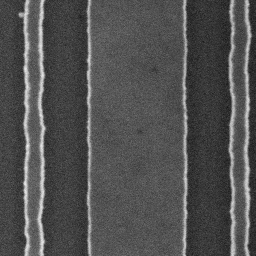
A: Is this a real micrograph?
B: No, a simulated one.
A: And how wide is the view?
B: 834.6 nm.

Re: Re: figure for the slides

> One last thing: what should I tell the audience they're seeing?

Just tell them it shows lines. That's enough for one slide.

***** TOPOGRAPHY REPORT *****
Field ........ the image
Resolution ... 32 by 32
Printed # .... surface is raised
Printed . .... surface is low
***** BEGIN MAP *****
...##......############......##.
...##......############......##.
...##......############......##.
...##......############......##.
...##......############......##.
...##......############......##.
...##......############......##.
...##......############......##.
...##......############......##.
...##......############......##.
...##......############......##.
...##......############......##.
...##......############......##.
...##......############......##.
...##......############......##.
...##......############......##.
...##......############......##.
...##......############......##.
...##......############......##.
...##......############......##.
...##......############......##.
...##......############......##.
...##......############......##.
...##......############......##.
...##......############......##.
...##......############......##.
...##......############......##.
...##......############......##.
...##......############......##.
...##......############......##.
...##......############......##.
...##......############......##.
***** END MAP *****